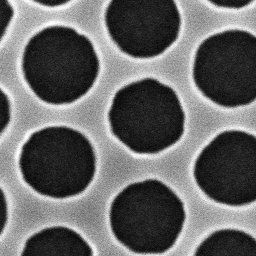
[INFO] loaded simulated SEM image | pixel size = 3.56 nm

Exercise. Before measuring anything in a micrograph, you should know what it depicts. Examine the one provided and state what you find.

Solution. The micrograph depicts holes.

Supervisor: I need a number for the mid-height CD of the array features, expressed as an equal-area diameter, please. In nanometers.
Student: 268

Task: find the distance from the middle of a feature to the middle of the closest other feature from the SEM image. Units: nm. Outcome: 351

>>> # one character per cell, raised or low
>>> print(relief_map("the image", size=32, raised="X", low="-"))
-XXXX---XXXXXX--------XXXXX----X
--XXXXXXXXXXX---------XXXXXXXXXX
-XXXXXXXXXXXX----------XXXXXXXXX
-XXXXX---XXXX---------XXXXXXXXXX
XXXX-------XXX--------XXXX------
XXX---------XX--------XXX-------
XXX---------XXX-----XXXXX-------
XXX---------XXXXXXXXXXXX--------
XXX----------XXXXXXXXXXX--------
XXX---------XXXXXXXXXXXX--------
XXXX--------XXXX----XXXX--------
-XXX-------XXXX-------XXX-------
-XXXX-----XXXX--------XXXX------
-XXXXXXXXXXXXX---------XXXXXXXXX
-XXXXXXXXXXXXX---------XXXXXXXXX
-XXXXXXXXXXXXX---------XXXXXXXXX
XXXX------XXXX---------XXXXX---X
XXX--------XXXX-------XXXXX-----
XXX---------XXXX-----XXXXX------
XX----------XXXXXXXXXXXXX-------
XX----------XXXXXXXXXXXX--------
XXX---------XXXXXXXXXXXX--------
XXX---------XXXXXX--XXXX--------
XXXX-------XXXXX-----XXXX-------
-XXXXX---XXXXX--------XXXX------
-XXXXXXXXXXXXX---------XXXXX---X
-XXXXXXXXXXXXX---------XXXXXXXXX
-XXXXXXXXXXXXX---------XXXXXXXXX
-XXXXX---XXXXX---------XXXXXXXXX
XXXX------XXXX--------XXXX-----X
XXX--------XXXX-------XXX-------
XXX---------XXXXX----XXX--------